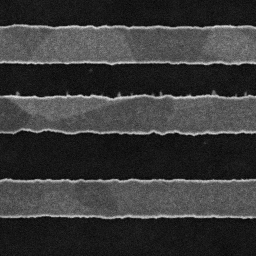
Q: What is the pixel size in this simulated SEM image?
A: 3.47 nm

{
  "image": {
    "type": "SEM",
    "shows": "lines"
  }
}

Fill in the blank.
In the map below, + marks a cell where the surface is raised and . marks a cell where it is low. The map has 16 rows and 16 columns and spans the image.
................
................
++++++++++++++++
++++++++++++++++
................
................
++++++++++++++++
++++++++++++++++
................
................
................
++++++++++++++++
++++++++++++++++
++++++++++++++++
................
................